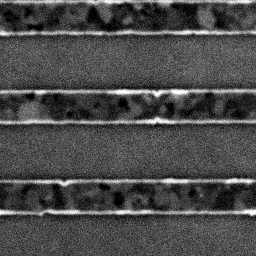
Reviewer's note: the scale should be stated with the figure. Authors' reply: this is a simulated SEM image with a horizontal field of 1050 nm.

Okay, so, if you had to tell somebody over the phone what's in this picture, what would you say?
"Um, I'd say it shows one or a few lines or trenches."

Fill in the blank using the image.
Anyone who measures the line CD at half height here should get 130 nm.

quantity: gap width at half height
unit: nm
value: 236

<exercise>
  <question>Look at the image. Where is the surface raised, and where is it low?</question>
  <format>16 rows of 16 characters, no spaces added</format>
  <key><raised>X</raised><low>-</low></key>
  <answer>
XXXXXXXXXXXXXXXX
XXXXXXXXXXXXXXXX
----------------
----------------
----------------
----------------
XXXXXXXXXXXXXXXX
XXXXXXXXXXXXXXXX
----------------
----------------
----------------
XXXXXXXXXXXXXXXX
XXXXXXXXXXXXXXXX
----------------
----------------
----------------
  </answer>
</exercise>